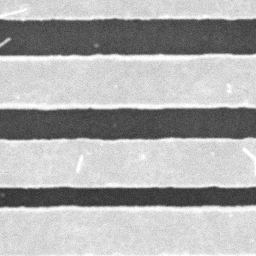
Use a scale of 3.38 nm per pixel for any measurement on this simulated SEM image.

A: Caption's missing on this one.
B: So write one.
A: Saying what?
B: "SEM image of lines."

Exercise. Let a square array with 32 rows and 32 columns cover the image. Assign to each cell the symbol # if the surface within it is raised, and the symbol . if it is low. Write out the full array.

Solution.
################################
################################
..#..#..........................
................................
................................
................................
................................
################################
################################
################################
################################
################################
################################
.....#..........................
................................
................................
................................
.......#.##.........#########.##
################################
################################
################################
################################
################################
................................
................................
................................
################################
################################
################################
################################
################################
################################